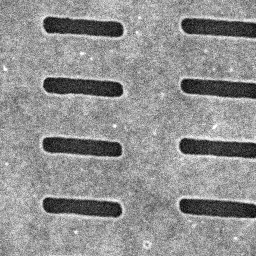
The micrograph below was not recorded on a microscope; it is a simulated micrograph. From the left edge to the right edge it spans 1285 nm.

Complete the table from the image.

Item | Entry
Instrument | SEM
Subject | holes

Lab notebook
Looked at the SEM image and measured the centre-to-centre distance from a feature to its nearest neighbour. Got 301 nm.